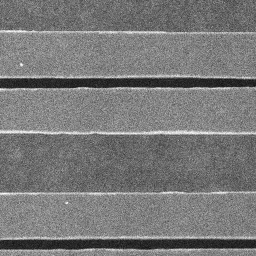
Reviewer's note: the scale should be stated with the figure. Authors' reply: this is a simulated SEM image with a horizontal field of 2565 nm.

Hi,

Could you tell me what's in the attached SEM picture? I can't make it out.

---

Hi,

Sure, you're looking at lines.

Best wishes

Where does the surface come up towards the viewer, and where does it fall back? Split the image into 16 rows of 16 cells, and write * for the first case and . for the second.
................
................
****************
****************
****************
....************
****************
****************
................
................
................
................
****************
****************
****************
................